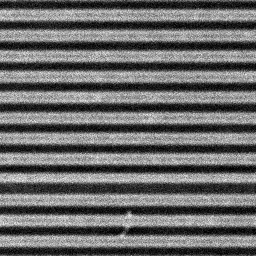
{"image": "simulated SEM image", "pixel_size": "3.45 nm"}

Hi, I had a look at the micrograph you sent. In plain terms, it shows parallel lines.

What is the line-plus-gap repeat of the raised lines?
70.6 nm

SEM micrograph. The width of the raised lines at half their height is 37.9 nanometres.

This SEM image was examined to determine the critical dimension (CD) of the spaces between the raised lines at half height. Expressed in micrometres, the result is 0.0349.